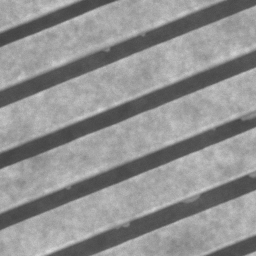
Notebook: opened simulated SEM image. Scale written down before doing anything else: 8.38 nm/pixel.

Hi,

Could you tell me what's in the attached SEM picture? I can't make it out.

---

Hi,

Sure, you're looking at lines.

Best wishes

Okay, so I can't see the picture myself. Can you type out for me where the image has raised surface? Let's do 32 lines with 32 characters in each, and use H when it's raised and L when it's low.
HHHHHHHHHLLLLHHHHHHHHHHHHHHLLLLL
HHHHHHHLLLLHHHHHHHHHHHHHHLLLLLHH
HHHHLLLLLHHHHHHHHHHHHHLLLLLHHHHH
HHLLLLHHHHHHHHHHHHHHLLLLLHHHHHHH
LLLLHHHHHHHHHHHHHLLLLLLHHHHHHHHH
LHHHHHHHHHHHHHLLLLLLHHHHHHHHHHHH
HHHHHHHHHHHHLLLLLHHHHHHHHHHHHHHL
HHHHHHHHHLLLLLLHHHHHHHHHHHHHHLLL
HHHHHHHLLLLLHHHHHHHHHHHHHHLLLLLL
HHHHHLLLLLHHHHHHHHHHHHHHLLLLLHHH
HHLLLLLHHHHHHHHHHHHHHHLLLLLHHHHH
LLLLLHHHHHHHHHHHHHHLLLLLHHHHHHHH
LLLHHHHHHHHHHHHHHLLLLLHHHHHHHHHH
HHHHHHHHHHHHHHLLLLLHHHHHHHHHHHHH
HHHHHHHHHHHHLLLLLHHHHHHHHHHHHHHL
HHHHHHHHHLLLLLHHHHHHHHHHHHHHLLLL
HHHHHHHLLLLLHHHHHHHHHHHHHHLLLLLH
HHHHLLLLLHHHHHHHHHHHHHHLLLLLHHHH
HHLLLLLHHHHHHHHHHHHHLLLLLLHHHHHH
LLLLHHHHHHHHHHHHHHLLLLLHHHHHHHHH
LLHHHHHHHHHHHHHLLLLLLHHHHHHHHHHH
HHHHHHHHHHHHHLLLLLHHHHHHHHHHHHHH
HHHHHHHHHHLLLLLLHHHHHHHHHHHHHLLL
HHHHHHHHLLLLLHHHHHHHHHHHHHHLLLLL
HHHHHHLLLLLHHHHHHHHHHHHHLLLLLLHH
HHHLLLLLHHHHHHHHHHHHHHLLLLLLHHHH
HLLLLLHHHHHHHHHHHHHLLLLLLHHHHHHH
LLLHHHHHHHHHHHHHHLLLLLLHHHHHHHHH
LHHHHHHHHHHHHHLLLLLLHHHHHHHHHHHH
HHHHHHHHHHHHLLLLLLHHHHHHHHHHHHHH
HHHHHHHHHLLLLLLHHHHHHHHHHHHHHLLL
HHHHHHHLLLLLLHHHHHHHHHHHHHHLLLLL